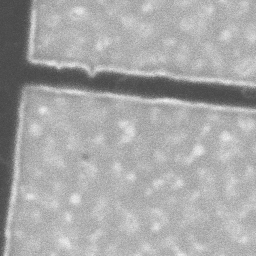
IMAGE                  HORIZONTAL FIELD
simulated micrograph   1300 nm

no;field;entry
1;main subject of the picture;one or a few lines or trenches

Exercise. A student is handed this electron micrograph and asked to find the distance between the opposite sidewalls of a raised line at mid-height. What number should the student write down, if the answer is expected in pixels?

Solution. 29.4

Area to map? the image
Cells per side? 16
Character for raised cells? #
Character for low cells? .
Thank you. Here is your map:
##..............
##..............
##..............
##..............
#########.......
################
#.........######
#...............
#...............
#...............
#...............
#...............
#...............
#...............
#...............
#...............